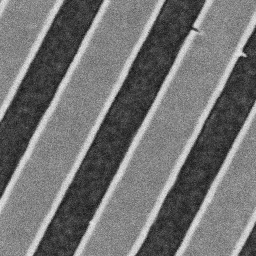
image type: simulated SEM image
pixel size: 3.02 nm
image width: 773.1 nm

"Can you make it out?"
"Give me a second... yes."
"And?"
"one or a few lines or trenches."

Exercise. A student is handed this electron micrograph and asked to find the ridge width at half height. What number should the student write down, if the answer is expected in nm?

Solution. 152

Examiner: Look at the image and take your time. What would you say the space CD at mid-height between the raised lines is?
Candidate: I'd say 0.122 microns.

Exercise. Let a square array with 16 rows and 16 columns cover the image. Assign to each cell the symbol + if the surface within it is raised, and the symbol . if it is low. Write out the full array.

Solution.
++++..++++...+++
+++...+++...++++
+++..++++...+++.
++...+++...++++.
+...++++...+++..
+...+++...++++..
...++++...+++...
...+++...++++...
..++++...+++...+
..+++...++++..++
.++++...+++...++
.+++...++++..+++
++++...+++...+++
+++...++++..++++
+++...+++...++++
++...++++..++++.